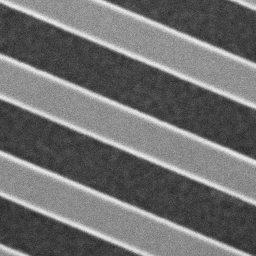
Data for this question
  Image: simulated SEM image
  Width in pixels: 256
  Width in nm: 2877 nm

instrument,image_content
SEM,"lines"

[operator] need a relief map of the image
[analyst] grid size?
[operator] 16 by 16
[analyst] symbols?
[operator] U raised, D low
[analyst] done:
DUUUUUUUDDDDDDDD
DDDUUUUUUUDDDDDD
DDDDDDUUUUUUDDDD
DDDDDDDDUUUUUUUD
UUUDDDDDDDUUUUUU
UUUUUDDDDDDDDUUU
DUUUUUUDDDDDDDDU
DDDUUUUUUUDDDDDD
DDDDDDUUUUUUDDDD
DDDDDDDDUUUUUUUD
UUUDDDDDDDUUUUUU
UUUUUDDDDDDDDUUU
DUUUUUUDDDDDDDDU
DDDUUUUUUUDDDDDD
DDDDDUUUUUUUDDDD
UDDDDDDDUUUUUUDD